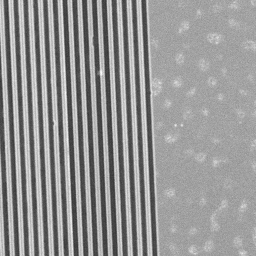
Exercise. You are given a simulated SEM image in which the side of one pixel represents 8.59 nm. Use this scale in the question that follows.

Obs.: parallel lines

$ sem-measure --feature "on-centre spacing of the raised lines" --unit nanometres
84.4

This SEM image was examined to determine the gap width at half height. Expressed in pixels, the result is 5.37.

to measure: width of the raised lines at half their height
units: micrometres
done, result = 0.0375